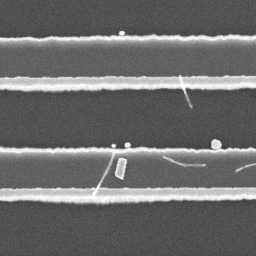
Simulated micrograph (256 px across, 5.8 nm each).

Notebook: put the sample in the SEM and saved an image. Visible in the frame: lines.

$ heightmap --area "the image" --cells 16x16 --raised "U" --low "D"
DDDDDDDDDDDDDDDD
DDDDDDDDDDDDDDDD
UUUUUUUUUUUUUUUU
UUUUUUUUUUUUUUUU
UUUUUUUUUUUUUUUU
DDDDDDDDDDDDDDDD
DDDDDDDDDDDDDDDD
DDDDDDDDDDDDDDDD
DDDDDDDDDDDDDDDD
UUUUUUUUUUUUUUUU
UUUUUUUUUUUUUUUU
UUUUUUUUUUUUUUUU
DDDDDDDDDDDDDDDD
DDDDDDDDDDDDDDDD
DDDDDDDDDDDDDDDD
DDDDDDDDDDDDDDDD